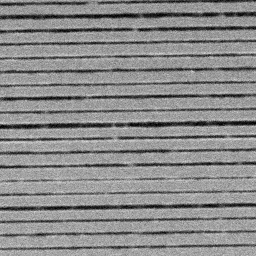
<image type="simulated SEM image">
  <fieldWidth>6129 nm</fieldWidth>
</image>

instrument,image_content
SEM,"parallel lines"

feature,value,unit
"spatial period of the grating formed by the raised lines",326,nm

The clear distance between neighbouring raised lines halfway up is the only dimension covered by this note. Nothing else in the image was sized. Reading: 83.8 nm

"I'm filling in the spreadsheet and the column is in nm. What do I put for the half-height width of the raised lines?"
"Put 227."